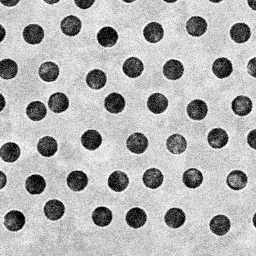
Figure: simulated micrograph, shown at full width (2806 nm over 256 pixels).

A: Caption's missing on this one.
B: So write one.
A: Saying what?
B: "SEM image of a regular array of holes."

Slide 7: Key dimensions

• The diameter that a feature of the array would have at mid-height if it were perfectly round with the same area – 240 nanometres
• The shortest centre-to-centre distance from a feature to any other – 411 nm